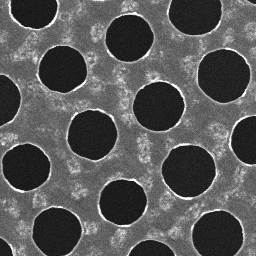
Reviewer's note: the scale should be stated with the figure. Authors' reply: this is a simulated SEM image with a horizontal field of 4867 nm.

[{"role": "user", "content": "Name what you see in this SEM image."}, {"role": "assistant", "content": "a regular array of holes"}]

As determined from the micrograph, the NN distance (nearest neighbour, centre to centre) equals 1370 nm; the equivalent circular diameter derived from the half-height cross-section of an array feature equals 0.924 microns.